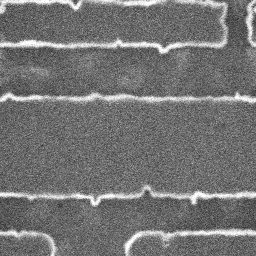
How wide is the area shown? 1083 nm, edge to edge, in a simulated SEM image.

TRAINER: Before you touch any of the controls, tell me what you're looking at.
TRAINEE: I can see one or a few lines or trenches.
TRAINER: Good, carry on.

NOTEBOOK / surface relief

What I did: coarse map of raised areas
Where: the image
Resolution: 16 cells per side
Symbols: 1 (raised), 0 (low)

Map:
1111111111111100
1111111111111101
1111111111111100
0000000000000000
0000000000000000
0000000000000000
1111111111111111
1111111111111111
1111111111111111
1111111111111111
1111111111111111
1111111111111111
0000010000000000
0000000000000000
0000000000001111
1110000011111111